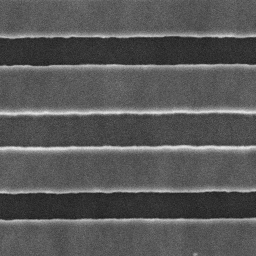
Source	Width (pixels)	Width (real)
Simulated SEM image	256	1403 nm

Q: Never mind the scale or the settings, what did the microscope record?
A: lines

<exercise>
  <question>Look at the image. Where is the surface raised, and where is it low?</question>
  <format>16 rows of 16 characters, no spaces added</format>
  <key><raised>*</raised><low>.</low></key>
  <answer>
****************
****************
................
................
****************
****************
****************
................
................
****************
****************
****************
................
................
****************
****************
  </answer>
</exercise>